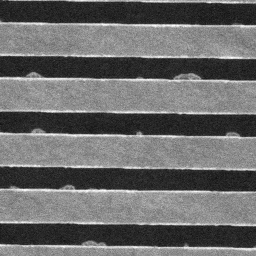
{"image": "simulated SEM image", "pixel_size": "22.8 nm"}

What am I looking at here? lines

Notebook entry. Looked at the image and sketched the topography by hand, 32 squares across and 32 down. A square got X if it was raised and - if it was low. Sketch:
--------------------------------
--------------------------------
--------------------------------
XXXXXXXXXXXXXXXXXXXXXXXXXXXXXXXX
XXXXXXXXXXXXXXXXXXXXXXXXXXXXXXXX
XXXXXXXXXXXXXXXXXXXXXXXXXXXXXXXX
XXXXXXXXXXXXXXXXXXXXXXXXXXXXXXXX
--------------------------------
--------------------------------
--------------------------------
XXXXXXXXXXXXXXXXXXXXXXXXXXXXXXXX
XXXXXXXXXXXXXXXXXXXXXXXXXXXXXXXX
XXXXXXXXXXXXXXXXXXXXXXXXXXXXXXXX
XXXXXXXXXXXXXXXXXXXXXXXXXXXXXXXX
--------------------------------
--------------------------------
--------------------------------
XXXXXXXXXXXXXXXXXXXXXXXXXXXXXXXX
XXXXXXXXXXXXXXXXXXXXXXXXXXXXXXXX
XXXXXXXXXXXXXXXXXXXXXXXXXXXXXXXX
XXXXXXXXXXXXXXXXXXXXXXXXXXXXXXXX
--------------------------------
--------------------------------
--------------------------------
XXXXXXXXXXXXXXXXXXXXXXXXXXXXXXXX
XXXXXXXXXXXXXXXXXXXXXXXXXXXXXXXX
XXXXXXXXXXXXXXXXXXXXXXXXXXXXXXXX
XXXXXXXXXXXXXXXXXXXXXXXXXXXXXXXX
--------------------------------
--------------------------------
--------------------------------
XXXXXXXXXXXXXXXXXXXXXXXXXXXXXXXX